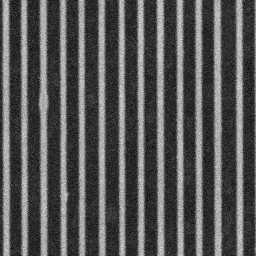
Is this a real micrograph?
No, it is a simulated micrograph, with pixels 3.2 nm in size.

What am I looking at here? parallel lines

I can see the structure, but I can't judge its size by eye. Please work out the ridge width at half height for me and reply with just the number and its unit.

19.6 nm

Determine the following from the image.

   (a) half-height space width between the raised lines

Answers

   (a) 44.4 nm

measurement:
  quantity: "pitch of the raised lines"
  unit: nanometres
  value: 62.2